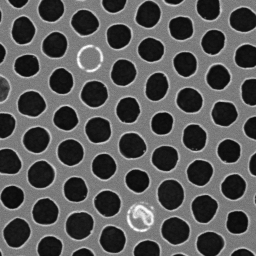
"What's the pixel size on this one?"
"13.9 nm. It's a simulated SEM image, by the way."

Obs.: a regular array of holes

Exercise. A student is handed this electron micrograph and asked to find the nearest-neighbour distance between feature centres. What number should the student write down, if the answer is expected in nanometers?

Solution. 492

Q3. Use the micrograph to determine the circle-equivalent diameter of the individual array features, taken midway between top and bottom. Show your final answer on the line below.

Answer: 0.353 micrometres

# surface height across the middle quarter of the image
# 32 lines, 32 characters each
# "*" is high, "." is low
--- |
************......*********.....
.***********......**********....
..**********......****...****...
..**********......***.....******
..****...***.....****.....******
..***.....**********......******
..***......*********......***...
.***.......*********.....****...
****.......****..****....***....
*****.....****....**********....
.*****...****......**********...
..***********......**********...
...**********......****...******
...****..*****....****.....*****
....**.....****..*****.....*****
...**.......**********.....****.
..***.......**********.....***..
******......***...*****...****..
******.....***.....***********..
....***...****......**********..
....**********.......****.****..
.....*********.......**.....****
.....****..****.....**......****
.....***....****..****......****
....***......*********......****
*******......**********.....***.
*******......****..*****...****.
********.....***.....**********.
**..*****..****......**********.
.....**********......****...****
......**********.....***.....***
......***********...***.......**